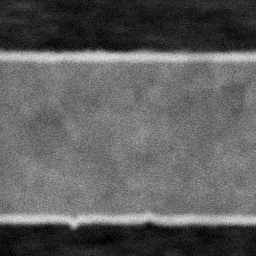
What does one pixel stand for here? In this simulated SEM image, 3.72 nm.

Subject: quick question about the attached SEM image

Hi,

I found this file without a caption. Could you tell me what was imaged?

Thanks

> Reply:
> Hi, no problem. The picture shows one or a few lines or trenches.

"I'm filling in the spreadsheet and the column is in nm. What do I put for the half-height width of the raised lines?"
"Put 602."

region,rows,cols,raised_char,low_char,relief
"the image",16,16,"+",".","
................
................
................
................
++++++++++++++++
++++++++++++++++
++++++++++++++++
++++++++++++++++
++++++++++++++++
++++++++++++++++
++++++++++++++++
++++++++++++++++
++++++++++++++++
++++++++++++++++
................
................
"